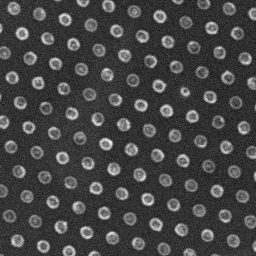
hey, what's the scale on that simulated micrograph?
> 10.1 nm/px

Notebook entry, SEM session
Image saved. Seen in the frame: a regular array of raised bodies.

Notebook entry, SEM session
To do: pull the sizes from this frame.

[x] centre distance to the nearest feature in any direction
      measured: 26 pixels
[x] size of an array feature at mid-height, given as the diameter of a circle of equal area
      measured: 121 nanometres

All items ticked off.